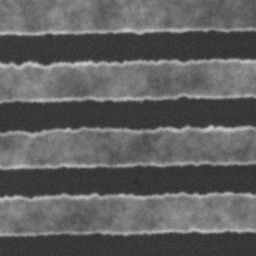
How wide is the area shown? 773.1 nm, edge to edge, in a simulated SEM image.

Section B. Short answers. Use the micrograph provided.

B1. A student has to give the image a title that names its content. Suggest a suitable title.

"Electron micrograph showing lines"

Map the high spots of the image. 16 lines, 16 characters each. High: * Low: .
****************
****************
................
................
****************
****************
................
................
****************
****************
*...............
................
****************
****************
**************..
................